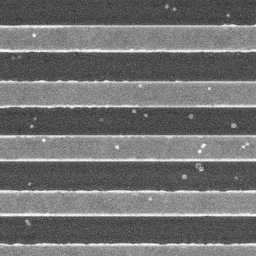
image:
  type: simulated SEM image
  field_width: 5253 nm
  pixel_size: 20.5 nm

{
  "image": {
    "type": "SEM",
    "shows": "lines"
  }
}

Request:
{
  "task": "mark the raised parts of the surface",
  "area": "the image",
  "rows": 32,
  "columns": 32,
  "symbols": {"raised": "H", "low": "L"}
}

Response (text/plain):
LLLLLLLLLLLLLLLLLLLLLLLLLLLLLLLL
LLLLLLLLLLLLLLLLLLLLLLLLLLLLLLLL
LLLLLLLLLLLLLLLLLLLLLLLLLLLLLLLL
HHHHHHHHHHHHHHHHHHHHHHHHHHHHHHHH
HHHHHHHHHHHHHHHHHHHHHHHHHHHHHHHH
HHHHHHHHHHHHHHHHHHHHHHHHHHHHHHHH
LLLLLLLLLLLLLLLLLLLLLLLLLLLLLLLL
LLLLLLLLLLLLLLLLLLLLLLLLLLLLLLLL
LLLLLLLLLLLLLLLLLLLLLLLLLLLLLLLL
LLLLLLLLLLLLLLLLLLLLLLLLLLLLLLLL
HHHHHHHHHHHHHHHHHHHHHHHHHHHHHHHH
HHHHHHHHHHHHHHHHHHHHHHHHHHHHHHHH
HHHHHHHHHHHHHHHHHHHHHHHHHHHHHHHH
LLLLLLLLLLLLLLLLLLLLLLLLLLLLLLLL
LLLLLLLLLLLLLLLLLLLLLLLLLLLLLLLL
LLLLLLLLLLLLLLLLLLLLLLLLLLLLLLLL
LLLLLLLLLLLLLLLLLLLLLLLLLLLLLLLL
HHHHHHHHHHHHHHHHHHHHHHHHHHHHHHHH
HHHHHHHHHHHHHHHHHHHHHHHHHHHHHHHH
HHHHHHHHHHHHHHHHHHHHHHHHHHHHHHHH
LLLLLLLLLLLLLLLLLLLLLLLLLLLLLLLL
LLLLLLLLLLLLLLLLLLLLLLLLLLLLLLLL
LLLLLLLLLLLLLLLLLLLLLLLLLLLLLLLL
LLLLLLLLLLLLLLLLLLLLLLLLLLLLLLLL
HHHHHHHHHHHHHHHHHHHHHHHHHHHHHHHH
HHHHHHHHHHHHHHHHHHHHHHHHHHHHHHHH
HHHHHHHHHHHHHHHHHHHHHHHHHHHHHHHH
LLLLLLLLLLLLLLLLLLLLLLLLLLLLLLLL
LLLLLLLLLLLLLLLLLLLLLLLLLLLLLLLL
LLLLLLLLLLLLLLLLLLLLLLLLLLLLLLLL
LLLLLLLLLLLLLLLLLLLLLLLLLLLLLLLL
HHHHHHHHHHHHHHHHHHHHHHHHHHHHHHHH